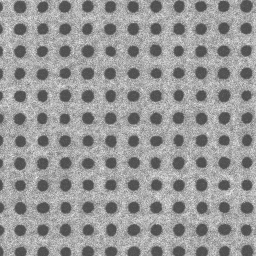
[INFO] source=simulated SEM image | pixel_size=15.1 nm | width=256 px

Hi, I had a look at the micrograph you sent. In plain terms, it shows a regular array of holes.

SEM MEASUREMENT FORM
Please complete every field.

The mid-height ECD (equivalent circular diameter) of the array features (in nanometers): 182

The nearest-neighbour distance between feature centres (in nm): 334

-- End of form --